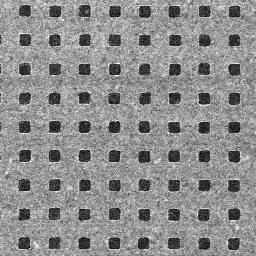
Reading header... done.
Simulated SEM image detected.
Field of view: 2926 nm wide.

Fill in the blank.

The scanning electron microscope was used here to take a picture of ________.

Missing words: a regular array of holes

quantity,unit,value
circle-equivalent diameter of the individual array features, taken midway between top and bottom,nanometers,154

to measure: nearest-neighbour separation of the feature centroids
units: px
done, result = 28.7